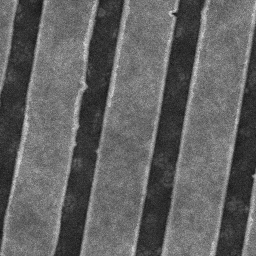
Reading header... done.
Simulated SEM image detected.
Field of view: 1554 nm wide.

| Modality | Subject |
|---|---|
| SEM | one or a few lines or trenches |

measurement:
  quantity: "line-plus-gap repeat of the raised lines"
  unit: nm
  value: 482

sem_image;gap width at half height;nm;176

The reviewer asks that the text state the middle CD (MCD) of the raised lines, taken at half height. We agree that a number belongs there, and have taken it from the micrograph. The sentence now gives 310 nm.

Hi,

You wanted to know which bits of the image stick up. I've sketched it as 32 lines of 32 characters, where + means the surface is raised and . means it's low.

++....++++++....++++++....++++++
++...+++++++...+++++++...+++++++
++...+++++++...+++++++...+++++++
+....++++++....+++++++...+++++++
+....++++++....++++++....++++++.
+....++++++....++++++....++++++.
+....++++++....++++++....++++++.
+...+++++++...+++++++....++++++.
+...+++++++...+++++++...+++++++.
....+++++++...+++++++...+++++++.
....+++++++...++++++....++++++..
....++++++....++++++....++++++..
...+++++++....++++++....++++++..
...+++++++...+++++++....++++++..
...+++++++...+++++++...+++++++..
...+++++++...+++++++...+++++++..
...++++++....++++++....++++++...
...++++++....++++++....++++++...
...++++++...+++++++....++++++...
..+++++++...+++++++....++++++...
..+++++++...+++++++...+++++++...
..+++++++...++++++....+++++++...
..++++++....++++++....++++++....
..++++++....++++++....++++++....
.+++++++...+++++++....++++++....
.+++++++...+++++++....++++++....
.+++++++...+++++++...+++++++...+
.++++++....++++++....++++++....+
.++++++....++++++....++++++....+
.++++++....++++++....++++++....+
+++++++...+++++++....++++++....+
+++++++...+++++++....++++++...++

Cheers